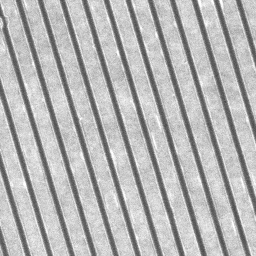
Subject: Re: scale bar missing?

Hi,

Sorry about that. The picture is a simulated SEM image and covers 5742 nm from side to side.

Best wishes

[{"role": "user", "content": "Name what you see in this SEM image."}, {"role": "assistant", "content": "parallel lines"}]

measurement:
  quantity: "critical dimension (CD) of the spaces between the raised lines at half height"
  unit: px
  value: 13.7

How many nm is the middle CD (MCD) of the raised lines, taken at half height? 167